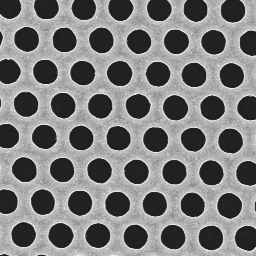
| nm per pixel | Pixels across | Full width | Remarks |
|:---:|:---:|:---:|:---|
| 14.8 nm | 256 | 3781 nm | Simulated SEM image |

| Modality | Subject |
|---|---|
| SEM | a regular array of holes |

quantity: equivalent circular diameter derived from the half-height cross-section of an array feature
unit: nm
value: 366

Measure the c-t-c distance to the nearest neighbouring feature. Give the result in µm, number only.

0.546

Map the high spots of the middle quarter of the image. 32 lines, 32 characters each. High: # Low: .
##.....####.....#####.....####..
##......###......####.....####..
##......###......###.......##...
##......###......####.....####..
###....#####....#####.....####..
##############.########.#######.
################################
.###############################
..#####....#####.....#####....##
...###......###......####......#
...###......###.......###......#
...###......####.....####......#
..#####....#####.....####......#
.########.########..######....##
################################
####.###########################
##.....####.....#####....#####..
##.....####.....####......###...
#......###.......###......###...
##.....####......###......###...
##.....####.....####......####..
####.########.#######....######.
################################
################################
..#####....######...######...###
..####......###......####.....##
...###......###......####......#
..####......###......####......#
..####.....#####.....####.....##
########..######....######....##
################################
################################